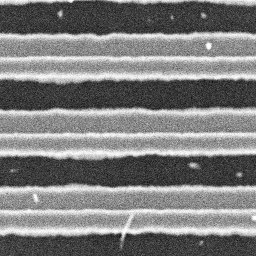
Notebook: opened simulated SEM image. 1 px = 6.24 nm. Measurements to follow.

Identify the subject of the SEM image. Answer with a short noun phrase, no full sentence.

lines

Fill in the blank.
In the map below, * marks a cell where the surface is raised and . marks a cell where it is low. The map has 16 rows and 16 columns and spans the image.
................
................
****************
****************
****************
................
................
****************
****************
****************
................
................
****************
****************
.****..**.......
................